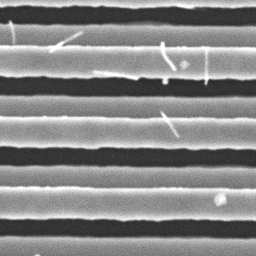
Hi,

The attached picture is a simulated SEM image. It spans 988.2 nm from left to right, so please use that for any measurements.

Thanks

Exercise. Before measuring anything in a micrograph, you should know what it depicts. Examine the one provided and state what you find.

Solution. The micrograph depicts lines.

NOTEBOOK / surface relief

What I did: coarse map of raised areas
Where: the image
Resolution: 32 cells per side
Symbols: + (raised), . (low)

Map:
++++++++++++++++++++++++++++++++
................................
................................
++++++++++++++++++++++++++++++++
++++++++++++++++++++++++++++++++
++++++++++++++++++++++++++++++++
++++++++++++++++++++++++++++++++
++++++++++++++++++++++++++++++++
++++++++++++++++++++++++++++++++
.++...++++++++++++++++++++++++++
................................
................................
++++++++++++++++++++++++++++++++
++++++++++++++++++++++++++++++++
++++++++++++++++++++++++++++++++
++++++++++++++++++++++++++++++++
++++++++++++++++++++++++++++++++
++++++++++++++++++++++++++++++++
..........++........++++++++++++
................................
................................
++++++++++++++++++++++++++++++++
++++++++++++++++++++++++++++++++
++++++++++++++++++++++++++++++++
++++++++++++++++++++++++++++++++
++++++++++++++++++++++++++++++++
++++++++++++++++++++++++++++++++
...............+...+........+..+
................................
................................
++++++++++++++++++++++++++++++++
++++++++++++++++++++++++++++++++